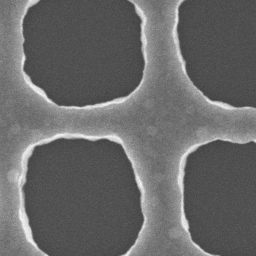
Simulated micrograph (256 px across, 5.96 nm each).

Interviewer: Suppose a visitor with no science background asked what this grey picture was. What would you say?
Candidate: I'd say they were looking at holes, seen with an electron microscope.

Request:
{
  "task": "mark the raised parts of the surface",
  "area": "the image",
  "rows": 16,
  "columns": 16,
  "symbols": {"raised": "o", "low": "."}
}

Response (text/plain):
oo.......oo.....
o........oo.....
o........oo.....
o........oo.....
o........ooo....
oo.......ooo....
oooo..oooooooo..
oooooooooooooooo
oooooooooooooooo
oo......oooo....
o.......ooo.....
o........oo.....
o........oo.....
oo.......ooo....
oo.......ooo....
oo......ooooo...